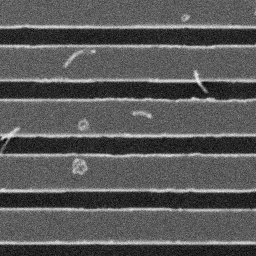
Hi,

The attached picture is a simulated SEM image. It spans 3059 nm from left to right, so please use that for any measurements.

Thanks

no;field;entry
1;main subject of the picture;lines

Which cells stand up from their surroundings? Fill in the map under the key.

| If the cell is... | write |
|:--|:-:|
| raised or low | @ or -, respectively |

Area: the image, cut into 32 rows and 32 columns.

@@@@@@@@@@@@@@@@@@@@@@@@@@@@@@@@
@@@@@@@@@@@@@@@@@@@@@@@@@@@@@@@@
@@@@@@@@@@@@@@@@@@@@@@@@@@@@@@@@
--------------------------------
--------------------------------
--------------------------------
@@@@@@@@@@@@@@@@@@@@@@@@@@@@@@@@
@@@@@@@@@@@@@@@@@@@@@@@@@@@@@@@@
@@@@@@@@@@@@@@@@@@@@@@@@@@@@@@@@
@@@@@@@@@@@@@@@@@@@@@@@@@@@@@@@@
--------------------------------
--------------------------------
@@@@@@@@@@@@@@@@@@@@@-@@@@@-@@@@
@@@@@@@@@@@@@@@@@@@@@@@@@@@@@@@@
@@@@@@@@@@@@@@@@@@@@@@@@@@@@@@@@
@@@@@@@@@@@@@@@@@@@@@@@@@@@@@@@@
@@@@@@@@@@@@@@@@@@@@@@@@@@@@@@@@
--------------------------------
--------------------------------
@@@@@@@@@@@@@@@@@@@@@@@@@@@@@@@@
@@@@@@@@@@@@@@@@@@@@@@@@@@@@@@@@
@@@@@@@@@@@@@@@@@@@@@@@@@@@@@@@@
@@@@@@@@@@@@@@@@@@@@@@@@@@@@@@@@
@@@@@@@@@@@@@@@@@@@@@@@@@@@@@@@@
--------------------------------
--------------------------------
@@@@@@@@@@@@@@@@@@@@@@@@@@@@@@@@
@@@@@@@@@@@@@@@@@@@@@@@@@@@@@@@@
@@@@@@@@@@@@@@@@@@@@@@@@@@@@@@@@
@@@@@@@@@@@@@@@@@@@@@@@@@@@@@@@@
--------------------------------
--------------------------------